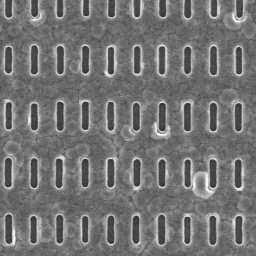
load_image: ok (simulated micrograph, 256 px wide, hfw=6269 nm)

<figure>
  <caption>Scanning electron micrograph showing a regular array of holes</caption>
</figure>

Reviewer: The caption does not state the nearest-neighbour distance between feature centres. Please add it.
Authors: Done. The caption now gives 0.616 µm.